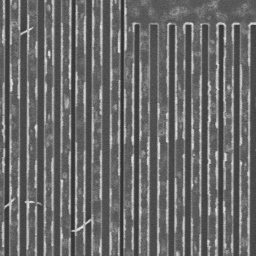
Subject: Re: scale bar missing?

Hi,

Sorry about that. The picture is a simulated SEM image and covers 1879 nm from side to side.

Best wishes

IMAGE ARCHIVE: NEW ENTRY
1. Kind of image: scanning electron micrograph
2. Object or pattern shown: parallel lines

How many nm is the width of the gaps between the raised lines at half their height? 44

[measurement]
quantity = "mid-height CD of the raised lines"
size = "76.1 nm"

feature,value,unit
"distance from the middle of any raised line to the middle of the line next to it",121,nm